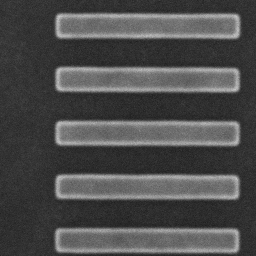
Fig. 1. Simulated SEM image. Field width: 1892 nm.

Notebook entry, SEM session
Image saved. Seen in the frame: groups of lines, slits or small figures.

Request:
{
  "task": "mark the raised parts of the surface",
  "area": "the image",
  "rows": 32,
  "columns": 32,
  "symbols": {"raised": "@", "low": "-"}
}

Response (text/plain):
--------------------------------
--------------------------------
-------@@@@@@@@@@@@@@@@@@@@@@@--
-------@@@@@@@@@@@@@@@@@@@@@@@--
-------@@@@@@@@@@@@@@@@@@@@@@@--
--------------------------------
--------------------------------
--------------------------------
--------------------------------
-------@@@@@@@@@@@@@@@@@@@@@@@--
-------@@@@@@@@@@@@@@@@@@@@@@@--
--------------------------------
--------------------------------
--------------------------------
--------------------------------
-------@@@@@@@@@@@@@@@@@@@@@@@--
-------@@@@@@@@@@@@@@@@@@@@@@@--
-------@@@@@@@@@@@@@@@@@@@@@@@--
--------------------------------
--------------------------------
--------------------------------
--------------------------------
-------@@@@@@@@@@@@@@@@@@@@@@@--
-------@@@@@@@@@@@@@@@@@@@@@@@--
-------@@@@@@@@@@@@@@@@@@@@@@@--
--------------------------------
--------------------------------
--------------------------------
--------------------------------
-------@@@@@@@@@@@@@@@@@@@@@@@--
-------@@@@@@@@@@@@@@@@@@@@@@@--
--------------------------------